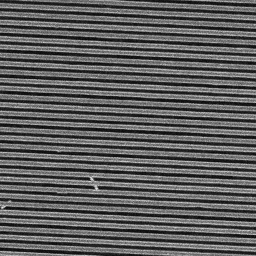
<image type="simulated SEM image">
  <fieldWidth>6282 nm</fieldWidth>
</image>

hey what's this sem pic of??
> parallel lines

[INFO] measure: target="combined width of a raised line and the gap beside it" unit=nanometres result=202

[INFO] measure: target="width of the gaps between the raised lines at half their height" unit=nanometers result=95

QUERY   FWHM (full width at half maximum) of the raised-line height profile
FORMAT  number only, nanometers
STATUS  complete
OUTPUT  116